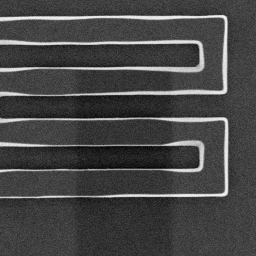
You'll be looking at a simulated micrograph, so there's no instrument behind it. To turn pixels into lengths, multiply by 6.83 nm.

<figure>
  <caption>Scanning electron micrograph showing groups of lines, slits or small figures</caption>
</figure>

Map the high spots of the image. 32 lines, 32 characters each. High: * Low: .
................................
................................
****************************....
****************************....
****************************....
.........................***....
.........................***....
.........................***....
.........................***....
****************************....
****************************....
****************************....
................................
................................
................................
****************************....
****************************....
****************************....
.........................***....
.........................***....
.........................***....
****************************....
****************************....
****************************....
***************.................
................................
................................
................................
................................
................................
................................
................................